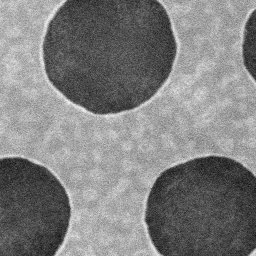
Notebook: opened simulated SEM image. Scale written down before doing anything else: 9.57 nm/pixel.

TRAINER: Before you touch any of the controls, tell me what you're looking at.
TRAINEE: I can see holes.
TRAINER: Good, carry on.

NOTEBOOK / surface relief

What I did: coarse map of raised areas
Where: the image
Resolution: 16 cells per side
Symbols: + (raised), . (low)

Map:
++++......++++++
+++........++++.
+++........++++.
+++........++++.
+++........++++.
+++.......++++++
+++++....+++++++
++++++++++++++++
++++++++++++++++
++++++++++++++++
...++++++++....+
....++++++......
....+++++.......
....+++++.......
....+++++.......
....++++++......